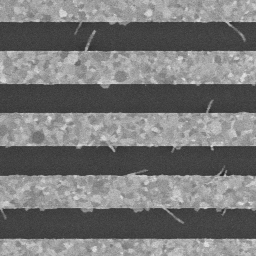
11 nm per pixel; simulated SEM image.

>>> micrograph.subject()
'lines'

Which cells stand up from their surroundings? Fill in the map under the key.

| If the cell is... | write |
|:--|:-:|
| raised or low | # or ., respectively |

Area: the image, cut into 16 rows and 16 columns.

################
................
................
################
################
................
................
################
################
................
................
################
################
................
................
################